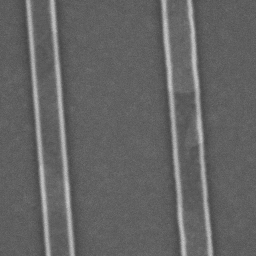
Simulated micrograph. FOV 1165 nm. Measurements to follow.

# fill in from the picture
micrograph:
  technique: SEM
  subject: one or a few lines or trenches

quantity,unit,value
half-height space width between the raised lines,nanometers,503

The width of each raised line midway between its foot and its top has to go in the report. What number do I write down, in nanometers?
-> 115